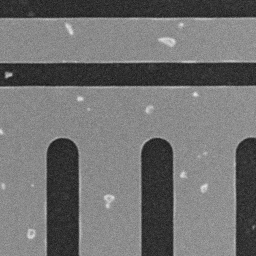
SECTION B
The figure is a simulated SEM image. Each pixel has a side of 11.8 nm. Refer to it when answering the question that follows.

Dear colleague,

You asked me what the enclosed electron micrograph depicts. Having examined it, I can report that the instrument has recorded groups of lines, slits or small figures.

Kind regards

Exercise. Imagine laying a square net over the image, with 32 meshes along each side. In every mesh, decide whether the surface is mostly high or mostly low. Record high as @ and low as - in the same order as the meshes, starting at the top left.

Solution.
--------------------------------
--------------------------------
@@@@@@@@@@@@@@@@@@@@@@@@@@@@@@@@
@@@@@@@@@@@@@@@@@@@@@@@@@@@@@@@@
@@@@@@@@@@@@@@@@@@@@@@@@@@@@@@@@
@@@@@@@@@@@@@@@@@@@@@@@@@@@@@@@@
@@@@@@@@@@@@@@@@@@@@@@@@@@@@@@@@
@@@@@@@@@@@@@@@@@@@@@@@@@@@@@@@@
--------------------------------
--------------------------------
--------------------------------
@@@@@@@@@@@@@@@@@@@@@@@@@@@@@@@@
@@@@@@@@@@@@@@@@@@@@@@@@@@@@@@@@
@@@@@@@@@@@@@@@@@@@@@@@@@@@@@@@@
@@@@@@@@@@@@@@@@@@@@@@@@@@@@@@@@
@@@@@@@@@@@@@@@@@@@@@@@@@@@@@@@@
@@@@@@@@@@@@@@@@@@@@@@@@@@@@@@@@
@@@@@@@--@@@@@@@@@@--@@@@@@@@@--
@@@@@@----@@@@@@@@----@@@@@@@@--
@@@@@@----@@@@@@@@----@@@@@@@---
@@@@@@----@@@@@@@@----@@@@@@@---
@@@@@@----@@@@@@@@----@@@@@@@---
@@@@@@----@@@@@@@@----@@@@@@@---
@@@@@@----@@@@@@@@----@@@@@@@---
@@@@@@----@@@@@@@@----@@@@@@@---
@@@@@@----@@@@@@@@----@@@@@@@---
@@@@@@----@@@@@@@@----@@@@@@@---
@@@@@@----@@@@@@@@----@@@@@@@---
@@@@@@----@@@@@@@@----@@@@@@@---
@@@@@@----@@@@@@@@----@@@@@@@---
@@@@@@----@@@@@@@@----@@@@@@@---
@@@@@@----@@@@@@@@----@@@@@@@---